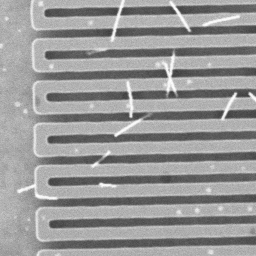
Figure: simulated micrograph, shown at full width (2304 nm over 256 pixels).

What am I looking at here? groups of lines, slits or small figures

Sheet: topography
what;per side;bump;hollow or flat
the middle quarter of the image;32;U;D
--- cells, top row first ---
UUUUUUUUUUUUUUUUUUUUUUUUUUUUUUUU
UUUUUUUUUUUDDDDDDDDDDDDDDUUDDDDD
DDDDDDDDDDDDDDDDDDDDDDDDDDUDDDDD
DDDDDDDDDDDDDDDDDDDDDDDDDDUDDDDD
UUUUUUUUUUUUUUUUUUUUUUUUUUUUUUUU
UUUUUUUUUUUUUUUUUUUUUUUUUUUUUUUU
UUUUUUUUUUUUUUUUUUUUUUDDDUUUDDDD
DDDDDDDDDDDDDDDDDDDDDDDDDDDDDDDD
DDDDDDDDDDDDDDDDUDDDDDDDDDDDDDDD
UUUUUUUUUUUUUUUUUUUUUUUUUUUUUUUU
UUUUUUUUUUUUUUUUUUUUUUUUUUUUUUUU
UUUUUUUUUUUUUUUUUUUUUUUUUUUUUUUU
DDDDDDDDDDDDDDDDDDDDDDDDDDDDDDDD
DDDDDDDDDDDDDDDDDDDDDDDDDDDDDDDD
DDDDDDDDDDUUUUUUUUUUUUUUUUUUUUUU
UUUUUUUUUUUUUUUUUUUUUUUUUUUUUUUU
UUUUUUUUUUUUUUUUUUUUUUUUUUUUUUUU
UUUUUUUUUDDDUUDDDDDDDDDDDDDDDDDD
DDDDDDDDDDDDDDDDDDDDDDDDDDDDDDDD
DDDDDDDDDDDDDDDDDDDDUUUDUUUUUUUU
UUUUUUUUUUUUUUUUUUUUUUUUUUUUUUUU
UUUUUUUUUUUUUUUUUUUUUUUUUUUUUUUU
UUUUUUUUUUUUUUUUUUUUUUDDDDDDDDDD
DDDDDDDDDDDDDDDDDDDDDDDDDDDDDDDD
DDDDDDDDDDDDDDDDDDDDDDDDDDDDDDDD
UUUUUUUUUUUUUUUUUUUUUUUUUUUUUUUU
UUUUUUUUUUUUUUUUUUUUUUUUUUUUUUUU
UUUUUUUUUUUUUUUUUUUUUUUUUUUUUUUU
DDDDDDDDDDDDDDDDDDDDDDDDDDDDDDDD
DDDDDDDDDDDDDDDDDDDDDDDDDDDDDDDD
DDDDDUUUUUUUUUUUUUUUUUUUUUUUUUUU
UUUUUUUUUUUUUUUUUUUUUUUUUUUUUUUU